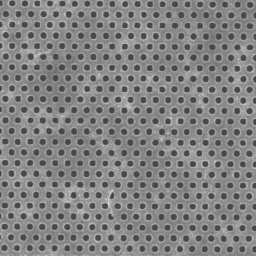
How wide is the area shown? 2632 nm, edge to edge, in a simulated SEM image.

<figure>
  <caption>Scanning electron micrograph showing a regular array of holes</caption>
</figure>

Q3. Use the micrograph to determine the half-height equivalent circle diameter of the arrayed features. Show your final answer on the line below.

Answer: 6.58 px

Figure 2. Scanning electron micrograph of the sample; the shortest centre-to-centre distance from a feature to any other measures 0.124 micrometres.